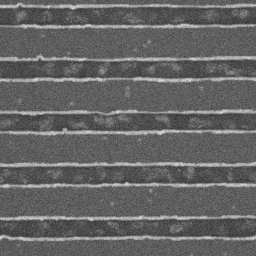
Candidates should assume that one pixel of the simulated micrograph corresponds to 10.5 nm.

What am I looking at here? parallel lines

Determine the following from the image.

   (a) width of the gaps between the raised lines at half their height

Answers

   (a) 197 nm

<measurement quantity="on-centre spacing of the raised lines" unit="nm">558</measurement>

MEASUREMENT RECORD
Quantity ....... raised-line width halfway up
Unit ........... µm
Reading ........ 0.364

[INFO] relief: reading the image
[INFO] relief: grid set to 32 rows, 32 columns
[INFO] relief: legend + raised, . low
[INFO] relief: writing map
++++++++++++++++++++++++++++++++
................................
................................
++++++++++++++++++++++++++++++++
++++++++++++++++++++++++++++++++
++++++++++++++++++++++++++++++++
++++++++++++++++++++++++++++++++
.........++++++++++++...........
................................
................................
++++++++++++++++++++++++++++++++
++++++++++++++++++++++++++++++++
++++++++++++++++++++++++++++++++
++++++++++++++++++++++++++++++++
................................
................................
..++..++++++++.....+++++++++++++
++++++++++++++++++++++++++++++++
++++++++++++++++++++++++++++++++
++++++++++++++++++++++++++++++++
+++++++++++++++++++.++++++++++++
................................
................................
++++++++++++++++++++++++++++++++
++++++++++++++++++++++++++++++++
++++++++++++++++++++++++++++++++
++++++++++++++++++++++++++++++++
...........+....................
................................
+...............................
++++++++++++++++++++++++++++++++
++++++++++++++++++++++++++++++++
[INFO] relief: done